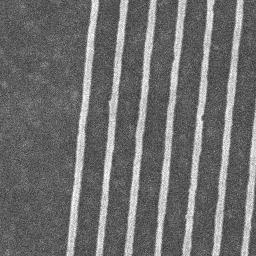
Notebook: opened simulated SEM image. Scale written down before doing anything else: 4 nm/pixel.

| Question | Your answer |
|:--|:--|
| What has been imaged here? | parallel lines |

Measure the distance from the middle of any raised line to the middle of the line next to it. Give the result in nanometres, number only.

116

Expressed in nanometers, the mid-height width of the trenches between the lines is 93.1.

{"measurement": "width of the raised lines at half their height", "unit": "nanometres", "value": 23.9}